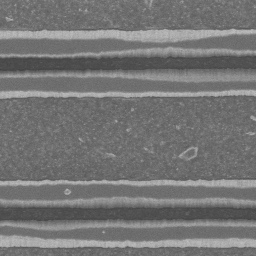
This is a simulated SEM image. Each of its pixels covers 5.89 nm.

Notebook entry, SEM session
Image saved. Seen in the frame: lines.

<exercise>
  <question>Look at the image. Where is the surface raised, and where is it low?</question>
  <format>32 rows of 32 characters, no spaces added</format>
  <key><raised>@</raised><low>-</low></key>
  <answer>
--------------------------------
--------------------------------
--------------------------------
--------------------------------
@@@@@@@@@@@@@@@@@@@@@@@@@@@@@@@@
@@@@@@@@@@@@@@@@@@@@@@@@@@@@@@@@
@@@@@@@@@@@@@@@@@@@@@@@@@@@@@@@@
--------------------------------
--------------------------------
@@@@@@@@@@@@@@@@@@@@@@@@@@@@@@@@
@@@@@@@@@@@@@@@@@@@@@@@@@@@@@@@@
@@@@@@@@@@@@@@@@@@@@@@@@@@@@@@@@
--------------------------------
--------------------------------
--------------------------------
--------------------------------
--------------------------------
--------------------------------
--------------------------------
--------------------------------
--------------------------------
--------------------------------
--------------------------------
@@@@@@@@@@@@@@@@@@@@@@@@@@@@@@@@
@@@@@@@@@@@@@@@@@@@@@@@@@@@@@@@@
@@@@@@@@@@@@@@@@@@@@@@@@@@@@@@@@
--------------------------------
--------------------------------
@@@@@@@@@@@@@@@@@@@@@@@@@@@@@@@@
@@@@@@@@@@@@@@@@@@@@@@@@@@@@@@@@
@--@@@@@@@@@@@@@@@@@@@@@@@@@@@@@
--------------------------------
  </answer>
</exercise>